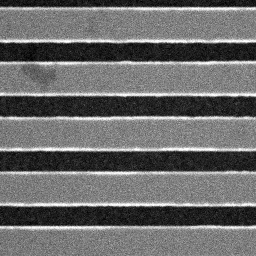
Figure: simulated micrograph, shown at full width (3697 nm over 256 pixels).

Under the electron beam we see lines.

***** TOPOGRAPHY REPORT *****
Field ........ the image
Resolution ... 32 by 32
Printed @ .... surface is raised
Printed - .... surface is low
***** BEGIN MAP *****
--------------------------------
@@@@@@@@@@@@@@@@@@@@@@@@@@@@@@@@
@@@@@@@@@@@@@@@@@@@@@@@@@@@@@@@@
@@@@@@@@@@@@@@@@@@@@@@@@@@@@@@@@
@@@@@@@@@@@@@@@@@@@@@@@@@@@@@@@@
--------------------------------
--------------------------------
--------------------------------
@@@@@@@@@@@@@@@@@@@@@@@@@@@@@@@@
@@@@@@@@@@@@@@@@@@@@@@@@@@@@@@@@
@@@@@@@@@@@@@@@@@@@@@@@@@@@@@@@@
@@@@@@@@@@@@@@@@@@@@@@@@@@@@@@@@
--------------------------------
--------------------------------
--------------------------------
@@@@@@@@@@@@@@@@@@@@@@@@@@@@@@@@
@@@@@@@@@@@@@@@@@@@@@@@@@@@@@@@@
@@@@@@@@@@@@@@@@@@@@@@@@@@@@@@@@
@@@@@@@@@@@@@@@@@@@@@@@@@@@@@@@@
--------------------------------
--------------------------------
----------------------------@@@-
@@@@@@@@@@@@@@@@@@@@@@@@@@@@@@@@
@@@@@@@@@@@@@@@@@@@@@@@@@@@@@@@@
@@@@@@@@@@@@@@@@@@@@@@@@@@@@@@@@
@@@@@@@@@@@@@@@@@@@@@@@@@@@@@@@@
--------------------------------
--------------------------------
@@@@@@@@@@@@@@@@@@@@@@@@@@@@@@@@
@@@@@@@@@@@@@@@@@@@@@@@@@@@@@@@@
@@@@@@@@@@@@@@@@@@@@@@@@@@@@@@@@
@@@@@@@@@@@@@@@@@@@@@@@@@@@@@@@@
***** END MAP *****